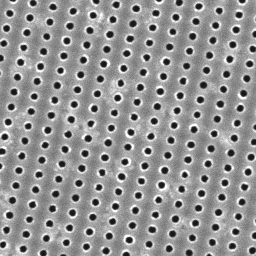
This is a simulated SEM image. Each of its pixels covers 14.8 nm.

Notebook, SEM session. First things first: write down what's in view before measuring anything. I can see a regular array of holes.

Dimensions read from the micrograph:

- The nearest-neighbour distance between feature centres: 0.224 um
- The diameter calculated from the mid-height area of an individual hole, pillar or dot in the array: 0.111 µm